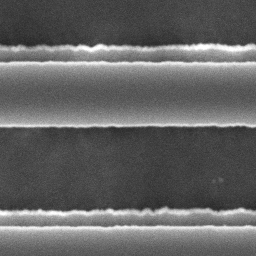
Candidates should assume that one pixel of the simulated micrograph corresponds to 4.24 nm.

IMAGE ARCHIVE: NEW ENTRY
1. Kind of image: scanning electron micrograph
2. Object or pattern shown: lines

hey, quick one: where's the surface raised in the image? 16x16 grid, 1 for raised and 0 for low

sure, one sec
0000000000000000
0000000000000000
0000000000000000
1111111111111111
1111111111111111
1111111111111111
1111111111111111
1111111111111111
0000000000000000
0000000000000000
0000000000000000
0000000000000000
0000000000000000
1111111111111111
1111111111111111
1111111111111111